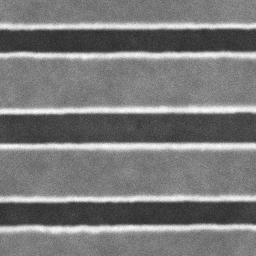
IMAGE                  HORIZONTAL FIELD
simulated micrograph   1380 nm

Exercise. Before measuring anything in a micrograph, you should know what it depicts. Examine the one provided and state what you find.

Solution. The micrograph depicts lines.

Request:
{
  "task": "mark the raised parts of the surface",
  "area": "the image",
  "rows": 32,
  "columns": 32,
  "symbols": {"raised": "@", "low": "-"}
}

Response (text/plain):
@@@@@@@@@@@@@@@@@@@@@@@@@@@@@@@@
@@@@@@@@@@@@@@@@@@@@@@@@@@@@@@@@
@@@@@@@@@@@@@@@@@@@@@@@@@@@@@@@@
@@@@@@@@@@@@@@@@@@@@@@@@@@@@@@@@
--------------------------------
--------------------------------
--------------------------------
@@@@@@@@@@@@@@@@@@@@@@@@@@@@@@@@
@@@@@@@@@@@@@@@@@@@@@@@@@@@@@@@@
@@@@@@@@@@@@@@@@@@@@@@@@@@@@@@@@
@@@@@@@@@@@@@@@@@@@@@@@@@@@@@@@@
@@@@@@@@@@@@@@@@@@@@@@@@@@@@@@@@
@@@@@@@@@@@@@@@@@@@@@@@@@@@@@@@@
@@@@@@@@@@@@@@@@@@@@@@@@@@@@@@@@
--------------------------------
--------------------------------
--------------------------------
--------------------------------
@@@@@@@@@@@@@@@@@@@@@@@@@@@@@@@@
@@@@@@@@@@@@@@@@@@@@@@@@@@@@@@@@
@@@@@@@@@@@@@@@@@@@@@@@@@@@@@@@@
@@@@@@@@@@@@@@@@@@@@@@@@@@@@@@@@
@@@@@@@@@@@@@@@@@@@@@@@@@@@@@@@@
@@@@@@@@@@@@@@@@@@@@@@@@@@@@@@@@
@@@@@@@@@@@@@@@@@@@@@@@@@@@@@@@@
--------------------------------
--------------------------------
--------------------------------
@@@@@@@@@@@@@@@@@@@@@@@@@@@@@@@@
@@@@@@@@@@@@@@@@@@@@@@@@@@@@@@@@
@@@@@@@@@@@@@@@@@@@@@@@@@@@@@@@@
@@@@@@@@@@@@@@@@@@@@@@@@@@@@@@@@